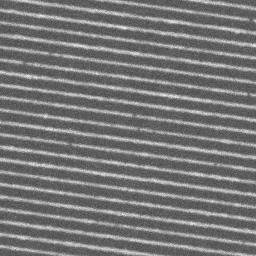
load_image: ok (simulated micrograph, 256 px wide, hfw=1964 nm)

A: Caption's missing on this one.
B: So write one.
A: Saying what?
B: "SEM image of parallel lines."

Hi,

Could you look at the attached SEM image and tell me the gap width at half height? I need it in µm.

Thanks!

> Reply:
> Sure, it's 0.0759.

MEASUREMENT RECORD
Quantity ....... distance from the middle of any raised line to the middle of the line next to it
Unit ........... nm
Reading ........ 94.5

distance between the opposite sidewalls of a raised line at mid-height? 19.9 nanometres